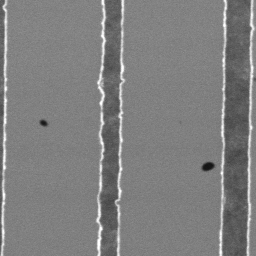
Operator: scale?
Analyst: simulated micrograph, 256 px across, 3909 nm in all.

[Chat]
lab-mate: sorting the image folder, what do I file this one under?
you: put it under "one or a few lines or trenches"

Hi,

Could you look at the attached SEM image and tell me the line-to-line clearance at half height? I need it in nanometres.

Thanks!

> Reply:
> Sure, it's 1520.